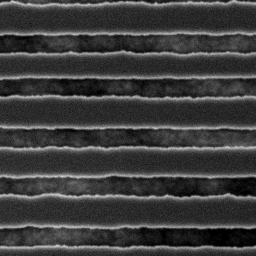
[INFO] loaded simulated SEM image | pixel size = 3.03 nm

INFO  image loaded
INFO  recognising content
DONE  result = lines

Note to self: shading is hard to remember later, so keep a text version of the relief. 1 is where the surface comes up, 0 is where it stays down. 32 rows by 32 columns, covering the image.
11110011010111111111111111111111
11111111111111111111111111111111
11111111111111111111111111111111
11111111111111111111111111111111
00000000000000000000000000000000
00000000000000000000000000000000
00000000000000010000000000000000
11111111111111111111111111111111
11111111111111111111111111111111
11111111111111111111111111111111
00000000000000000000000000000000
00000000000000000000000000000000
11111111111111111111111111111111
11111111111111111111111111111111
11111111111111111111111111111111
11111111111111111111111111111111
00000000000000000000000000000000
00000000000000000000000000000000
11011111111111111111111111111111
11111111111111111111111111111111
11111111111111111111111111111111
11111111111111111111111111111111
00000000000000000000000000000000
00000000000000000000000000000000
11100111101111110000000000011000
11111111111111111111111111111111
11111111111111111111111111111111
11111111111111111111111111111111
10000000000111101000000011101111
00000000000000000000000000000000
00000000000000000000000000000000
11111111111111111111111111111111